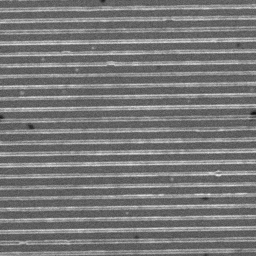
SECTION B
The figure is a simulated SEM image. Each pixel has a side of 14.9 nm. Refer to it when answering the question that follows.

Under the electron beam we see parallel lines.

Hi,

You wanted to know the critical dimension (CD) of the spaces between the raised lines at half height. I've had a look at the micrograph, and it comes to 0.119 micrometres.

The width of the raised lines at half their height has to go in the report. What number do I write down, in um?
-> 0.0464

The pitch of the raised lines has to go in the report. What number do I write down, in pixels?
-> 11.1